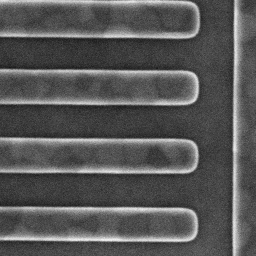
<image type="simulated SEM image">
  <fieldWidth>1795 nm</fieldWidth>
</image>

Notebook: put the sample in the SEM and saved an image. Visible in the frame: wiring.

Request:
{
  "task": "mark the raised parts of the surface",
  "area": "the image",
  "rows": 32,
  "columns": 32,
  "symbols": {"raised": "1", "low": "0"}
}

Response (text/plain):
11111111111111111111111100000111
11111111111111111111111110000111
11111111111111111111111110000111
11111111111111111111111110000111
11111111111111111111111100000111
00000000000000000000000000000111
00000000000000000000000000000111
00000000000000000000000000000111
00000000000000000000000000000111
11111111111111111111111100000111
11111111111111111111111110000111
11111111111111111111111110000111
11111111111111111111111100000111
00000000000000000000000000000111
00000000000000000000000000000111
00000000000000000000000000000111
00000000000000000000000000000111
11111111111111111111111000000111
11111111111111111111111110000111
11111111111111111111111110000111
11111111111111111111111110000111
11111111111111111111111100000111
00000000000000000000000000000111
00000000000000000000000000000111
00000000000000000000000000000111
00000000000000000000000000000111
11111111111111111111111100000111
11111111111111111111111110000111
11111111111111111111111110000111
11111111111111111111111100000111
00000000000000000000000000000111
00000000000000000000000000000111